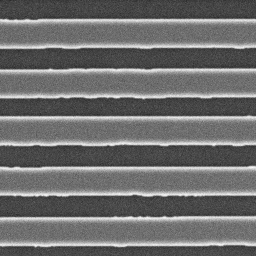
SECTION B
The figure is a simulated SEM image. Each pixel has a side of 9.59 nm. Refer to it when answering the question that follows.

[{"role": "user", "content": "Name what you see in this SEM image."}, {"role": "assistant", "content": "lines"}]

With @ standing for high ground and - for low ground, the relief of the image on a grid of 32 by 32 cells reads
--------------------------------
--------------------------------
@--@@@@@@@@@@@@@@@@@@@@@@@@@@@@@
@@@@@@@@@@@@@@@@@@@@@@@@@@@@@@@@
@@@@@@@@@@@@@@@@@@@@@@@@@@@@@@@@
@@@@@@@@@@@@@@@@@@@@@@@@@@@@@@@@
--------------------------------
--------------------------------
--------------------------------
@@@@@@@@@@@@@@@@@@@@@@@@@@@@@@@@
@@@@@@@@@@@@@@@@@@@@@@@@@@@@@@@@
@@@@@@@@@@@@@@@@@@@@@@@@@@@@@@@@
--------------------------------
--------------------------------
--------------------------------
@@@@@@@@@@@@@@@@@@@@@@@@@@@@@@@@
@@@@@@@@@@@@@@@@@@@@@@@@@@@@@@@@
@@@@@@@@@@@@@@@@@@@@@@@@@@@@@@@@
--------------------------------
--------------------------------
--------------------------------
@@@@@@@@@@@@@@@@@@@@@@@@@@@@@@@@
@@@@@@@@@@@@@@@@@@@@@@@@@@@@@@@@
@@@@@@@@@@@@@@@@@@@@@@@@@@@@@@@@
--------------------------------
--------------------------------
--------------------------------
@@@@@@@@@@@@@@@@@@@@@@@@@@@@@@@@
@@@@@@@@@@@@@@@@@@@@@@@@@@@@@@@@
@@@@@@@@@@@@@@@@@@@@@@@@@@@@@@@@
@@@@@@@@@@@@@@@@@@@@@@@@@@@@@@@@
--------------------------------